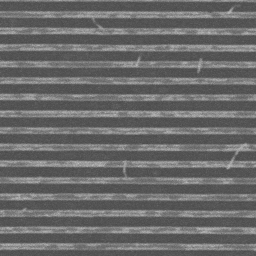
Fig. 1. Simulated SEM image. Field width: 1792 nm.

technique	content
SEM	parallel lines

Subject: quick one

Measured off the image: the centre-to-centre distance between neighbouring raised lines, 0.116 microns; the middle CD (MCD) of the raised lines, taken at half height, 38.5 nm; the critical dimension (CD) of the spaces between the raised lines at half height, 0.0762 micrometres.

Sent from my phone